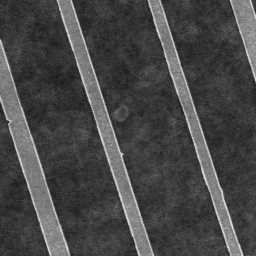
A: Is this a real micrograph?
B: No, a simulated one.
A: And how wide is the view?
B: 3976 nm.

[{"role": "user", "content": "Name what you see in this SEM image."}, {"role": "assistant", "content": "one or a few lines or trenches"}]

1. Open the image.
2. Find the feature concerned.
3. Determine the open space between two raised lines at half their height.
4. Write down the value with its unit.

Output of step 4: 67.1 pixels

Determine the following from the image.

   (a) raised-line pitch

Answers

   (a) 1310 nanometres